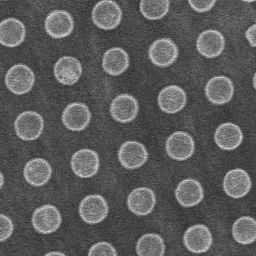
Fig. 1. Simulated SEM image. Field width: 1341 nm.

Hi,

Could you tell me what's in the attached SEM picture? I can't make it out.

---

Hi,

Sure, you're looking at a regular array of raised bodies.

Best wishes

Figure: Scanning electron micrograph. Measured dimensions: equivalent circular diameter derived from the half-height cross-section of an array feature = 0.145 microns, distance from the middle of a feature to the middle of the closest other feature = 247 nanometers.